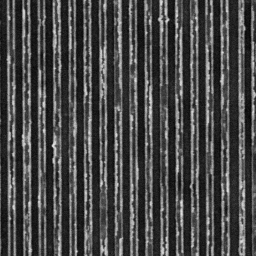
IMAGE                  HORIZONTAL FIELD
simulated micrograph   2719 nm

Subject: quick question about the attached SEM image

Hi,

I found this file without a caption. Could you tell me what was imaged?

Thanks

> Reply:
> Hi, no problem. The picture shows parallel lines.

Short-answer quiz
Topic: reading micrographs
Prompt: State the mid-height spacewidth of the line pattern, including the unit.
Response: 83.6 nm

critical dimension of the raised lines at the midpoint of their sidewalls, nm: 74.3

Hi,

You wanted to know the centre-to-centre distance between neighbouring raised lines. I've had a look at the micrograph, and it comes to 163 nm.